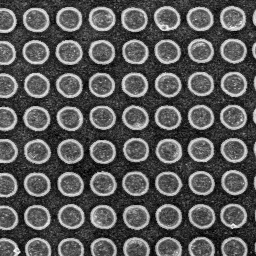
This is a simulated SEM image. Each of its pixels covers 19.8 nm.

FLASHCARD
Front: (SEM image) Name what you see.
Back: a regular array of raised bodies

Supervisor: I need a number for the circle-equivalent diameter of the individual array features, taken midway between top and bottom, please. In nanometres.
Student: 470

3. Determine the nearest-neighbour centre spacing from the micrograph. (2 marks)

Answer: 640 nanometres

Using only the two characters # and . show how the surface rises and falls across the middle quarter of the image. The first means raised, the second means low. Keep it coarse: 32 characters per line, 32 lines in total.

................................
................................
................###......#......
###....#####...#####...#####....
####...#####...######..######..#
####...#####...######..######..#
####...#####...######..######...
###.....###.....####.....###....
................................
................................
................................
###....#####...#####....####....
####...#####...######..######..#
####...######..######..######..#
####...#####...######..######...
####....####....####....####....
.#..............................
................................
................................
###.....###.....####....####....
####...#####...######...#####..#
####...######..######..######..#
####...######..######..######...
####...#####....####....#####...
.##......##..............##.....
................................
................................
###.....###.....###......##.....
####...#####...#####...######...
#####..######..######..######..#
#####..######..######..######...
#####..#####...######...#####...